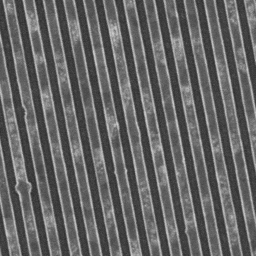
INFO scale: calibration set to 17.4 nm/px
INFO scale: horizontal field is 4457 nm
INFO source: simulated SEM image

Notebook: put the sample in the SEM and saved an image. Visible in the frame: parallel lines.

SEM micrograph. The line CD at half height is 0.178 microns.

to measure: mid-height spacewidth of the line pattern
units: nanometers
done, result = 163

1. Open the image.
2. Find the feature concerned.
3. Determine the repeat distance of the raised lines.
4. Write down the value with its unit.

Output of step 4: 344 nanometres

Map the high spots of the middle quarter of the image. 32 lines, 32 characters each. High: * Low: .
...**...**...***..***..***..***.
*..***..***..***..***..***..***.
*..***...**..***..***..***..***.
*...**...**...**...**...**...**.
*...**...**...**...**...**...**.
*...**...**...**...***..**...***
**..***..***..***..***..***..***
**..***..***..***..***..***..***
**..***...**...**...**...**...**
**...**...**...**...**...**...**
**...**...**...**...**...**...**
***..**...***..***..***..***..**
***..***..***..***..***..***..**
***...**...**...**...**..***..**
.**...**...**...**...**...**...*
.**...**...**...**...**...**...*
.**...**...***..***..***..***..*
.***..***..***..***..***..***..*
.***..***..***..***..***..***...
..**...**...**...**...**...**...
..**...**...**...**...**...**...
..**...**...***..***..**...**...
..***..***..***..***..***..***..
..***..***..***..***..***..***..
..***..***...**...**...**...**..
...**...**...**...**...**...**..
...**...**...***..**...**...**..
*..**...**...**...***..***..***.
*..***..***..***..***..***..***.
*..***...**...**...**..***..***.
*...**...**...**...**...**...**.
*...**...**...**...**...**...**.